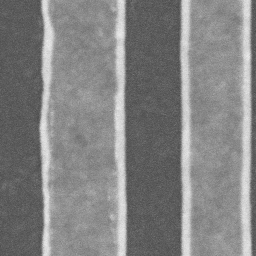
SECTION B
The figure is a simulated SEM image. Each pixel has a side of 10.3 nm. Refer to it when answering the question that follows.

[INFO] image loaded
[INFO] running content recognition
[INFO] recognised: one or a few lines or trenches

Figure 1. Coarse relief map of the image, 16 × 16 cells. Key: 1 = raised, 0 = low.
0001111100001110
0001111000001110
0001111000001110
0001111000001110
0001111100001110
0001111100001110
0001111100001110
0001111100001110
0001111100001110
0001111100001110
0001111100001110
0001111100001110
0001111100001110
0001111100001110
0001111100001110
0001111100001110